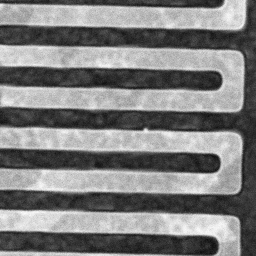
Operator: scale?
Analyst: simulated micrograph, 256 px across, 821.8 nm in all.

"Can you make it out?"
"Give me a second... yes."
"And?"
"groups of lines, slits or small figures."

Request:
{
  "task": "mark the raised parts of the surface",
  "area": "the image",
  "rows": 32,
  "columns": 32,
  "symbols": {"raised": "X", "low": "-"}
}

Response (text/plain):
----------------------------XXX-
XXXXXXXXXXXXXXXXXXXXXXXXXXXXXXX-
XXXXXXXXXXXXXXXXXXXXXXXXXXXXXXX-
------------------------XXXXXX--
--------------------------------
--------------------------------
XXXXXXXXXXXXXXXXXXXXXXXXXXXXXX--
XXXXXXXXXXXXXXXXXXXXXXXXXXXXXX--
-----------------XXXXXXXXXXXXX--
----------------------------XX--
----------------------------XX--
XXXXXXXXXXXXXXXXXXXXXXXX--XXXX--
XXXXXXXXXXXXXXXXXXXXXXXXXXXXXX--
--------XXXXXXXXXXXXXXXXXXXXXX--
--------------------------------
--------------------------------
XXXXXXXXXXXXXXXXXXXXXXXXX-------
XXXXXXXXXXXXXXXXXXXXXXXXXXXXXX--
-----XXXXXXXXXXXXXXXXXXXXXXXXX--
---------------------------XXX--
----------------------------XX--
XXXXXXXXXXXXXXXX-----------XXX--
XXXXXXXXXXXXXXXXXXXXXXXXXXXXXX--
XXXXXXXXXXXXXXXXXXXXXXXXXXXXXX--
--------------------------------
--------------------------------
XXXXXXX-------------------------
XXXXXXXXXXXXXXXXXXXXXXXXXXXXXX--
XXXXXXXXXXXXXXXXXXXXXXXXXXXXXX--
---------------------------XXX--
---------------------------XXX--
---------------------------XXX--